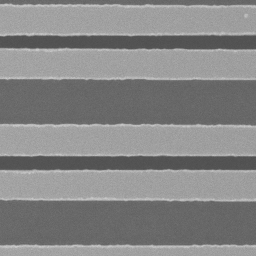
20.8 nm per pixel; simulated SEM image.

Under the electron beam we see lines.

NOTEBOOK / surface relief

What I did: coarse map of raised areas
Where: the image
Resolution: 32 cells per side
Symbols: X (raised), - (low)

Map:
X-------------------------------
XXXXXXXXXXXXXXXXXXXXXXXXXXXXXXXX
XXXXXXXXXXXXXXXXXXXXXXXXXXXXXXXX
XXXXXXXXXXXXXXXXXXXXXXXXXXXXXXXX
--------------------------------
--------------------------------
XXXXXXXXXXXXXXXXXXXXXXXXXXXXXXXX
XXXXXXXXXXXXXXXXXXXXXXXXXXXXXXXX
XXXXXXXXXXXXXXXXXXXXXXXXXXXXXXXX
XXXXXXXXXXXXXXXXXXXXXXXXXXXXXXXX
--------------------------------
--------------------------------
--------------------------------
--------------------------------
--------------------------------
---------------X----------------
XXXXXXXXXXXXXXXXXXXXXXXXXXXXXXXX
XXXXXXXXXXXXXXXXXXXXXXXXXXXXXXXX
XXXXXXXXXXXXXXXXXXXXXXXXXXXXXXXX
---X----------X-X------------X--
--------------------------------
XXXXXXXXXXXXXXXXXXXXXXXXXXXXXXXX
XXXXXXXXXXXXXXXXXXXXXXXXXXXXXXXX
XXXXXXXXXXXXXXXXXXXXXXXXXXXXXXXX
XXXXXXXXXXXXXXXXXXXXXXXXXXXXXXXX
--------------------------------
--------------------------------
--------------------------------
--------------------------------
--------------------------------
--------------------------------
XXXXXXXXXXXXXXXXXXXXXXXXXXXXXXXX